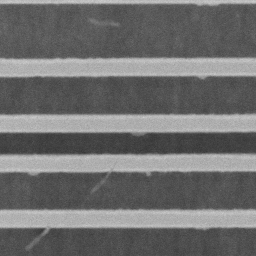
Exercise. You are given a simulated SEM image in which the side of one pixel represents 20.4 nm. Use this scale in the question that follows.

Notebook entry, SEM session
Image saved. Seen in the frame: lines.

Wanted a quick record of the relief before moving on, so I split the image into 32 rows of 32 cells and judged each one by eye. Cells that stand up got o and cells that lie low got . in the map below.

................................
................................
................................
................................
................................
................................
................................
oooooooooooooooooooooooooooooooo
oooooooooooooooooooooooooooooooo
oooo.o.o.o.oo...................
................................
................................
................................
................................
oooooooooooooooooooooooooooooooo
oooooooooooooooooooooooooooooooo
oooooooooooooooooooooooooooooooo
................................
................................
oooooooooooooooooooooooooooooooo
oooooooooooooooooooooooooooooooo
.............o..................
................................
................................
................................
................................
oooooooooooooooooooooooooooooooo
oooooooooooooooooooooooooooooooo
.....oo.........................
................................
................................
................................